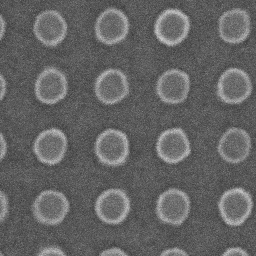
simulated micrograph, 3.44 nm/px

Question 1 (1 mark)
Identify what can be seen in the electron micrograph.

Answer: a regular array of raised bodies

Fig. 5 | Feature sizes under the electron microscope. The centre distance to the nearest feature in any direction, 0.205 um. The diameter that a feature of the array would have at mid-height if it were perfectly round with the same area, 112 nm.